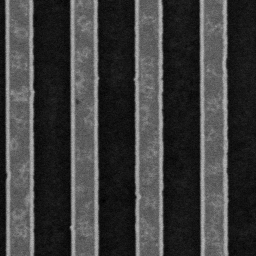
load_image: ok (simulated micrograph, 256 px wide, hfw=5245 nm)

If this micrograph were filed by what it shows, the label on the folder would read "one or a few lines or trenches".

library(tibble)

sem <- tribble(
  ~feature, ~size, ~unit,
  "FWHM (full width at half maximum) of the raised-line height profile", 482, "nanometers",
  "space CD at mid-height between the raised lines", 845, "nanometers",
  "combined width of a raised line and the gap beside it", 1330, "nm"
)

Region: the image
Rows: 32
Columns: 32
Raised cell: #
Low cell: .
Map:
.###.....###.....###.....###....
.###.....###.....###.....###....
.###.....###.....###.....###....
.###.....###.....###.....###....
.###.....###.....###.....###....
.###.....###.....###.....###....
.###.....###.....###.....###....
.###.....###.....###.....###....
.###.....###.....###.....###....
.###.....###.....###.....###....
.###.....###.....###.....###....
.###.....###.....###.....###....
.###.....###.....###.....###....
.###.....###.....###.....###....
.###.....###.....###.....###....
.###.....###.....###.....###....
.###.....###.....###.....###....
.###.....###.....###.....###....
.###.....###.....###.....###....
.###.....###.....###.....###....
.###.....###.....###.....###....
.###.....###.....###.....###....
.###.....###.....###.....###....
.###.....###.....###.....###....
.###.....###.....###.....###....
.###.....###.....###.....###....
.###.....###.....###.....###....
.###.....###.....###.....###....
.###.....###.....###.....###....
.###.....###.....###.....###....
.###.....###.....###.....###....
.###.....###.....###.....###....